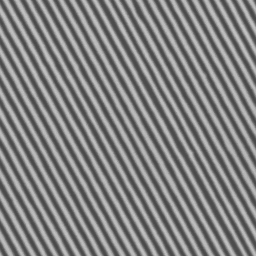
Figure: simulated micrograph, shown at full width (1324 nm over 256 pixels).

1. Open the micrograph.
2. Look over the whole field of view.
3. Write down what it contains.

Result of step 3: parallel lines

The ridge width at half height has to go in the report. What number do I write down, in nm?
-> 26.7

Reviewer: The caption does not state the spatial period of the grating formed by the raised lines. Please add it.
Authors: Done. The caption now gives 50.5 nm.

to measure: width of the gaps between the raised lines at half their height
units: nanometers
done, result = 23.8